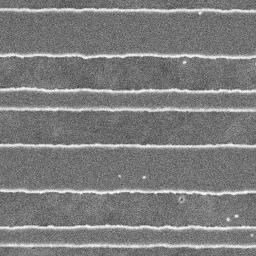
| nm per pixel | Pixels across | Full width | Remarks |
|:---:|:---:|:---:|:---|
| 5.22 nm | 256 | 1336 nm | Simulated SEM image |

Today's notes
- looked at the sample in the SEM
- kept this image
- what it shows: lines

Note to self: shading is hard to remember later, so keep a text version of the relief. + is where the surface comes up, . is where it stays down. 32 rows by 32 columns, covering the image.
................................
++++++++++++++++++++++++++++++++
++++++++++++++++++++++++++++++++
++++++++++++++++++++++++++++++++
++++++++++++++++++++++++++++++++
++++++++++++++++++++++++++++++++
++++++++++++++++++++++++++++++++
................................
................................
................................
................................
++++++++++++++++++++++++++++++++
++++++++++++++++++++++++++++++++
++++++++++++++++++++++++++++++++
................................
................................
................................
................................
++++++++++++++++++++++++++++++++
++++++++++++++++++++++++++++++++
++++++++++++++++++++++++++++++++
++++++++++++++++++++++++++++++++
++++++++++++++++++++++++++++++++
++++++++++++++++++++++++++++++++
................................
................................
................................
................................
++++++++++++++++++++++++++++++++
++++++++++++++++++++++++++++++++
++++++++++++++++++++++++++++++++
................................